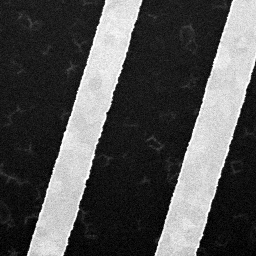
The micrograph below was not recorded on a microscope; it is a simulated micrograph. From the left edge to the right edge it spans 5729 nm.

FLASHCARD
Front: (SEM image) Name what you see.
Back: one or a few lines or trenches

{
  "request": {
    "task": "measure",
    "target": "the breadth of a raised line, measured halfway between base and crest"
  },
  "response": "34.8 px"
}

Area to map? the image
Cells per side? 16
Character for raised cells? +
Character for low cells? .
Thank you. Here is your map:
......+++.....++
......++......++
......++......++
......++......++
.....+++.....+++
.....++......++.
.....++......++.
....+++.....+++.
....++......+++.
....++......++..
...+++.....+++..
...++......+++..
...++......++...
..+++.....+++...
..++......+++...
..++......++....